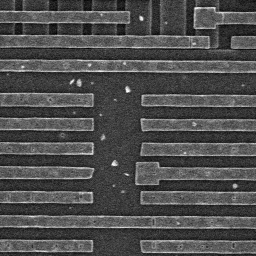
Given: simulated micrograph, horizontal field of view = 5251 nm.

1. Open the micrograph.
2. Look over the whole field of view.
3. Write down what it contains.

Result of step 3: wiring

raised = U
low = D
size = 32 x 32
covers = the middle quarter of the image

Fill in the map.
UUUUUUUUUUUUUUUUUUUUUUUUUUUUUUUU
UUUUUUUUUUUUUUUUUUUUUUUUUUUUUUUU
DDDDDDDDDDDDDDDDDDDDDDDDDDDDDDDD
DDDDDDDDDDDDDDDDDDDDDDDDDDDDDDDD
DDDUDDDDDDDDDDDDDDDDDDDDDDDDDDDD
DDDDDDDDDDDDDDDDDDDDDDDDDDDDDDDD
DDDDDDDDDDDDDDDDDDDDDDDDDDDDDDDD
DDDDDDDDDDDDDDDDDDDDDDDDDDDDDDDD
UUUUUUUDDDDDDDDDDDDDUUUUUUUUUUUU
UUUUUUUDDDDDDDDDDDDDUUUUUUUUUUUU
DDDDDDDDDDDDDDDDDDDDDDDDDDDDDDDD
DDDDDDDDDDDDDDDDDDDDDDDDDDDDDDDD
DDDDDDDDDDDDDDDDDDDDDDDDDDDDDDDD
DDDDDDDDDDDDDDDDDDDDDDDDDDDDDDDD
UUUUUUUDDDDDDDDDDDDUUUUUUUUUUUUU
UUUUUUUDDDDDDDDDDDDUUUUUUUUUUUUU
UUUUUUUDDDDDDDDDDDDDUUUUUUUUUUUU
DDDDDDDDDDDDDDDDDDDDDDDDDDDDDDDD
DDDDDDDDDDDDDDDDDDDDDDDDDDDDDDDD
DDDDDDDDDDDDDDDDDDDDDDDDDDDDDDDD
UUUUUUUDDDDDDDDDDDDDUUUUUUUUUUUU
UUUUUUUDDDDDDDDDDDDUUUUUUUUUUUUU
UDDDDDDDDDDDDDDDDDDUUUUUUUUUUUUU
DDDDDDDDDDDDDDDDDDDDDDDDDDDDDDDD
DDDDDDDDDDDDDDDDDDDDDDDDDDDDDDDD
DDDDDDDDDDDDDDDDDDUUUUUUDDDDDDDD
UUUUUUUDDDDDDDDDDDUUUUUUUUUUUUUU
UUUUUUUDDDDDDDDDDDUUUUUUUUUUUUUU
UUUUUUDDDDDDDDDDDDUUUUUUUUUUUUUU
DDDDDDDDDDDDDDDDDDUUUUUUDDDDDDDD
DDDDDDDDDDDDDDDDDDDDDDDDDDDDDDDD
DDDDDDDDDDDDDDDDDDDDDDDDDDDDDDDD